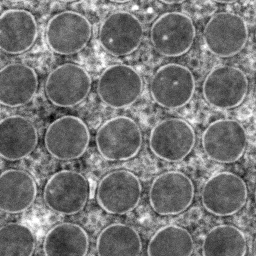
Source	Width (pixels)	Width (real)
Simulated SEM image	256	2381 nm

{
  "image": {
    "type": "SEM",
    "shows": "a regular array of raised bodies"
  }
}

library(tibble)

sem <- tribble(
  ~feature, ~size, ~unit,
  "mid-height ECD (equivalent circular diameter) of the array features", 0.404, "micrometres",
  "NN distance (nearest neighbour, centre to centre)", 0.484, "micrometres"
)